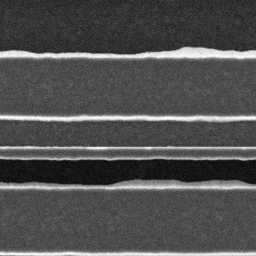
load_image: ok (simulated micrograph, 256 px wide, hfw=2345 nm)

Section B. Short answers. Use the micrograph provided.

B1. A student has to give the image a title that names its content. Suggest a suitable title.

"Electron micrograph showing lines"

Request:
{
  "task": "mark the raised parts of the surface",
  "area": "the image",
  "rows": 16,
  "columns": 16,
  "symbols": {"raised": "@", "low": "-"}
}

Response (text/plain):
----------------
----------------
----------------
@@@@@@@@@@@@@@@@
@@@@@@@@@@@@@@@@
@@@@@@@@@@@@@@@@
@@@@@@@@@@@@@@@@
@@@@@@@@@@@@@@@@
@@@@@@@@@@@@@@@@
@@@@@@@@@@@@@@@@
----------------
----------------
@@@@@@@@@@@@@@@@
@@@@@@@@@@@@@@@@
@@@@@@@@@@@@@@@@
@@@@@@@@@@@@@@@@